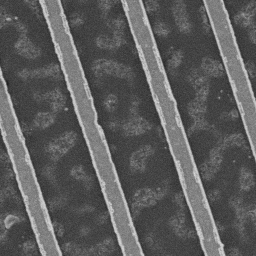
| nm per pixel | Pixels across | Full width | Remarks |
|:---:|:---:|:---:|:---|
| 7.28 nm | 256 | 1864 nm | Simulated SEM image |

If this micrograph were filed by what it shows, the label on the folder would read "one or a few lines or trenches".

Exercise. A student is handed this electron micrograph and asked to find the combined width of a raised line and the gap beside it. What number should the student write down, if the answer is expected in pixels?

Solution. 77.5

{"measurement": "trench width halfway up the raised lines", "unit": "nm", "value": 439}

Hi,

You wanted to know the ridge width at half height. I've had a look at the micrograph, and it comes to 125 nm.